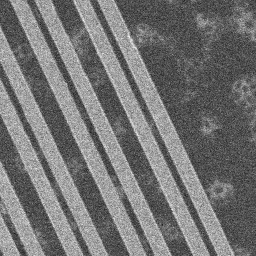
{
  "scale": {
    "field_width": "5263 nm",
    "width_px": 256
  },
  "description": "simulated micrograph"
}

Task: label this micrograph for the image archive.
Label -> parallel lines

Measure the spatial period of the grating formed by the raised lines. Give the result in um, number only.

0.568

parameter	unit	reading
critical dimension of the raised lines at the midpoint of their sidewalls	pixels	13.6